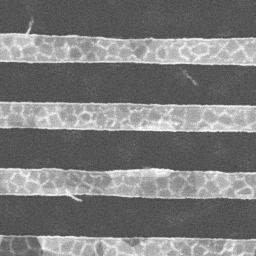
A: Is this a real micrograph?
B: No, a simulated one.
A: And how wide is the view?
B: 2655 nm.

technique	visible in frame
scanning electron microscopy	one or a few lines or trenches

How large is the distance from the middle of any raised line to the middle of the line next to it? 689 nm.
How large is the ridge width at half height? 262 nm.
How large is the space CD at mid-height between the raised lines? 0.428 microns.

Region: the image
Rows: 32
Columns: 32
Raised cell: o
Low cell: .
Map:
................................
................................
................................
................................
ooooo...........................
oooooooooooooooooooooooooooooooo
oooooooooooooooooooooooooooooooo
oooooooooooooooooooooooooooooooo
................................
................................
................................
................................
................................
oooooooooooooooooooooooooooooooo
oooooooooooooooooooooooooooooooo
oooooooooooooooooooooooooooooooo
................................
................................
................................
................................
................................
ooooooooooo...ooooooooooooo.....
oooooooooooooooooooooooooooooooo
oooooooooooooooooooooooooooooooo
.................ooooooooooooooo
................................
................................
................................
................................
................................
oooooooooooooo.ooooooooooooooooo
oooooooooooooooooooooooooooooooo